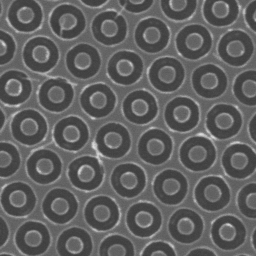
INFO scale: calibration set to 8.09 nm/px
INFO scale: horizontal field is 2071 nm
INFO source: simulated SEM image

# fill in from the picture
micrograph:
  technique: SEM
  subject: a regular array of ring-shaped grooves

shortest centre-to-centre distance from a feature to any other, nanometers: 339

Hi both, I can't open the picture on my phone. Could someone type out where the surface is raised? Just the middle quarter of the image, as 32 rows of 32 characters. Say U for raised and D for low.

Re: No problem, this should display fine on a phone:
UDDUUUDDDUUDDUUUUDDDUUDDDDDDDDUU
UDDDDDDDDUUDDUUUUDDDUDDDUUUUDDUU
UUDDDDDDUUUDDDUUDDDUUDDDUUUUDDUU
UUUDDDUUUUUUDDDDDDDUUDDDUUUUDDUU
DUUUUUUUUUUUUDDDDDUUUUDDDUUDDDUU
DDUUUUDDDDDUUUUUUUUUUUDDDDDDDUUU
DDUUUDDDDDDDUUUUUUUUUUUUDDDDUUUU
DDDUDDDUUUDDDUUUDDDDDDUUUUUUUUUU
DDUUDDDUUUDDDUUDDDDDDDDUUUUUDDDU
DDUUDDDUUUUDDUUDDUUUDDDUUUDDDDDD
DUUUDDDUUUDDDUUDDUUUUDDUUUDDDUDD
UUUUUDDDDDDDUUUDDUUUUDDUUDDDUUUD
UUUUUUDDDDDUUUUDDDUUDDDUUDDDUUUD
DDDDUUUUUUUUUUUDDDDDDDDUUDDDUUUD
DDDDDUUUUUUUUUUUUDDDDUUUUDDDDDDD
DUDDDDUUUUDDDDDUUUUUUUUUUUDDDDDD
UUUDDDUUUDDDDDDDUUUUUDDDUUUDDDDD
UUUUDDUUDDDUUDDDUUUUDDDDDDUUUUUU
UUUUDDUUDDUUUUDDDUUDDDDDDDDUUUUD
DDDDDDUUDDUUUUDDDUUDDUUUDDDUUUDD
DDDDDUUUDDDUUUDDDUDDDUUUUDDUUDDD
UDDDUUUUUDDDDDDDUUDDDUUUUDDUUDDD
UUUUUUUUUDDDDDDUUUUDDDUUDDDUUDDU
UUUUDDDDUUUUDDUUUUUDDDDDDDUUUDDU
UUDDDDDDDUUUUUUUUUUUDDDDDUUUUDDD
UDDDDUDDDDUUUDDDDDDUUUUUUUUUUUDD
UDDDUUUDDDUUDDDDDDDDUUUUUDDDUUUU
UDDDUUUUDDUUDDDUUDDDUUUUDDDDDDUU
UDDDUUUDDDUUDDUUUUDDUUUDDDDDDDUU
UUDDDDDDDUUUDDUUUUDDUUDDDUUUDDDU
UUDDDDDDDUUUDDDUUUDDUUDDDUUUUDDU
DUUUDDDUUUUUUDDDDDDDUUDDDUUUUDDU